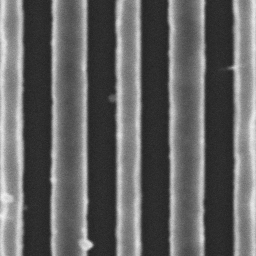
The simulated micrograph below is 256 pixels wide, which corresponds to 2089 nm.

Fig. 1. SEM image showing lines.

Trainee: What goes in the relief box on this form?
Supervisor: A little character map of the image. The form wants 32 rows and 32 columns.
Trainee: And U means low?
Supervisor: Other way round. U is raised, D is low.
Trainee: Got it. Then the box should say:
UUUDDDDUUUUDDDDUUDDDDUUUUUDDDUUU
UUUDDDDUUUUDDDDUUDDDDUUUUDDDDUUU
UUUDDDDUUUUDDDDUUDDDDUUUUDDDDUUU
UUUDDDDUUUUDDDDUUDDDDUUUUDDDDUUU
UUUDDDDUUUUDDDDUUDDDDUUUUDDDDUUU
UUUDDDUUUUUDDDDUUDDDDUUUUUDDDUUU
UUUDDDDUUUUDDDDUUDDDDUUUUDDDDUUU
UUUDDDDUUUUDDDDUUDDDDUUUUUDDDUUU
UUUDDDDUUUUDDDDUUDDDDUUUUUDDDUUU
UUUDDDDUUUUDDDDUUDDDDUUUUDDDDUUU
UUUDDDDUUUUDDDDUUDDDDUUUUDDDDDUU
UUUDDDDUUUUDDDDUUDDDDUUUUDDDDUUU
UUUDDDDUUUUDDDDUUDDDDUUUUDDDDDUU
UUUDDDDUUUUDDDDUUUDDDUUUUDDDDDUU
UUUDDDDUUUUDDDDUUDDDDUUUUDDDDDUU
UUUDDDDUUUUDDDDUUDDDDUUUUDDDDDUU
UUUDDDDUUUUDDDDUUDDDDUUUUDDDDUUU
UUUDDDDUUUUDDDDUUDDDDUUUUDDDDUUU
UUUDDDDUUUUDDDDUUDDDDUUUUDDDDUUU
UUUDDDUUUUUDDDDUUDDDDUUUUDDDDUUU
UUUDDDUUUUUDDDDUUDDDDUUUUDDDDDUU
UUUDDDUUUUUDDDDUUDDDDUUUUDDDDUUU
UUUDDDUUUUUDDDDUUDDDDUUUUDDDDUUU
UUUDDDDUUUUDDDDUUDDDDUUUUDDDDUUU
UUUDDDUUUUUDDDDUUDDDDUUUUDDDDUUU
UUUDDDUUUUUDDDDUUDDDDUUUUDDDDUUU
UUUDDDUUUUUDDDDUUDDDDUUUUDDDDUUU
UUUDDDUUUUUDDDDUUDDDDUUUUDDDDUUU
UUUDDDUUUUUDDDDUUDDDDUUUUDDDDUUU
UUUDDDUUUUUDDDDUUDDDDUUUUDDDDUUU
UUUDDDUUUUUDDDDUUDDDDUUUUDDDDUUU
UUUDDDUUUUUDDDDUUDDDDUUUUDDDDUUU